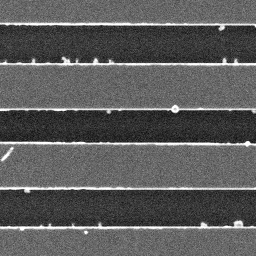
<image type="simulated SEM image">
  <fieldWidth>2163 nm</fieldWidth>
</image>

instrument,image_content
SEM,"lines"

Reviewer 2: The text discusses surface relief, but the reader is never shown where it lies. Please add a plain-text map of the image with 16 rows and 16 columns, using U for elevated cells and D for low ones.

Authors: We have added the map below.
UUUUUUUUUUUUUUUU
UUUUUUUUUUUUUUUU
DDDDDDDDDDDDDDDD
DDDDDDDDDDDDDDDD
UUUUUUUUUUUUUUUU
UUUUUUUUUUUUUUUU
UUUUUUUUUUUUUUUU
DDDDDDDDDDDDDDDD
DDDDDDDDDDDDDDDD
UUUUUUUUUUUUUUUU
UUUUUUUUUUUUUUUU
UUUUUUUUUUUUUUUU
DDDDDDDDDDDDDDDD
DDDDDDDDDDDDDDDD
UUUUUUUUUUUUUUUU
UUUUUUUUUUUUUUUU